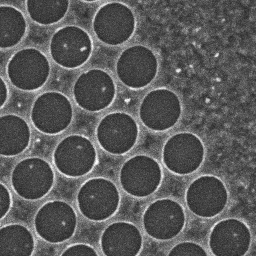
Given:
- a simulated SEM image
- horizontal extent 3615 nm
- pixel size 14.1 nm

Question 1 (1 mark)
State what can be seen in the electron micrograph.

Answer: a regular array of holes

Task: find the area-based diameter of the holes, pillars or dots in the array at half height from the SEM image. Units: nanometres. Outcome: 588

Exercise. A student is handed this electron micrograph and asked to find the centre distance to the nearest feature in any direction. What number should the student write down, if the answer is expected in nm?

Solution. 680